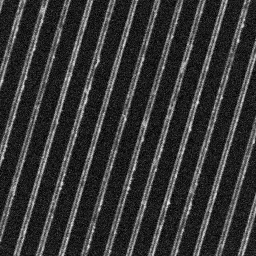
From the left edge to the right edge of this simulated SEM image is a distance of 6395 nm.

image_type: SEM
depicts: parallel lines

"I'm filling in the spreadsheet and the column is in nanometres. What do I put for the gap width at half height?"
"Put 435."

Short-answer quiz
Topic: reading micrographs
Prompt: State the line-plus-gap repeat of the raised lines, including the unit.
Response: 538 nanometres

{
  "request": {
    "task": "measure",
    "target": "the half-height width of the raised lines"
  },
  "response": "0.114 microns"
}